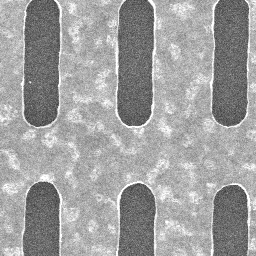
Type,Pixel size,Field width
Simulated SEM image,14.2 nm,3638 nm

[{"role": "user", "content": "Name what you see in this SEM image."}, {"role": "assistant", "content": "holes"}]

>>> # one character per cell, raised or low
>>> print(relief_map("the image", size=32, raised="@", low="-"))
@@@@---@@@@@@@@----@@@@@@@@----@
@@@----@@@@@@@@----@@@@@@@@----@
@@@-----@@@@@@@----@@@@@@@@----@
@@@-----@@@@@@@----@@@@@@@@----@
@@@-----@@@@@@@----@@@@@@@@----@
@@@-----@@@@@@@----@@@@@@@@----@
@@@----@@@@@@@@----@@@@@@@@----@
@@@----@@@@@@@@----@@@@@@@@----@
@@@----@@@@@@@@----@@@@@@@@----@
@@@----@@@@@@@@----@@@@@@@@----@
@@@----@@@@@@@@----@@@@@@@@----@
@@@----@@@@@@@@----@@@@@@@-----@
@@@----@@@@@@@@----@@@@@@@-----@
@@@----@@@@@@@@----@@@@@@@-----@
@@@----@@@@@@@@----@@@@@@@@----@
@@@@--@@@@@@@@@@--@@@@@@@@@---@@
@@@@@@@@@@@@@@@@@@@@@@@@@@@@@@@@
@@@@@@@@@@@@@@@@@@@@@@@@@@@@@@@@
@@@@@@@@@@@@@@@@@@@@@@@@@@@@@@@@
@@@@@@@@@@@@@@@@@@@@@@@@@@@@@@@@
@@@@@@@@@@@@@@@@@@@@@@@@@@@@@@@@
@@@@@@@@@@@@@@@@@@@@@@@@@@@@@@@@
@@@@@@@@@@@@@@@@@@@@@@@@@@@@@@@@
@@@@---@@@@@@@@@---@@@@@@@@@--@@
@@@----@@@@@@@@----@@@@@@@@----@
@@@-----@@@@@@@----@@@@@@@@----@
@@@----@@@@@@@@-----@@@@@@@----@
@@@----@@@@@@@@----@@@@@@@-----@
@@@-----@@@@@@@----@@@@@@@-----@
@@@----@@@@@@@@----@@@@@@@-----@
@@@----@@@@@@@@----@@@@@@@@----@
@@@-----@@@@@@@----@@@@@@@@----@